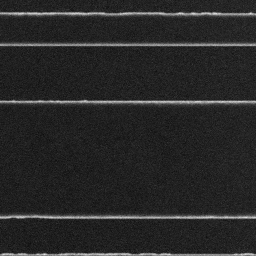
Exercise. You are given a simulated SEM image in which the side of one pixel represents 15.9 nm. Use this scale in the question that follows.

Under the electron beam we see lines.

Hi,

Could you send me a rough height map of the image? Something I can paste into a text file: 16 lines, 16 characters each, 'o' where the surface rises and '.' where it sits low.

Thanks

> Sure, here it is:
................
oooooooooooooooo
oooooooooooooooo
................
................
................
oooooooooooooooo
oooooooooooooooo
oooooooooooooooo
oooooooooooooooo
oooooooooooooooo
oooooooooooooooo
oooooooooooooooo
oooooooooooooooo
................
................